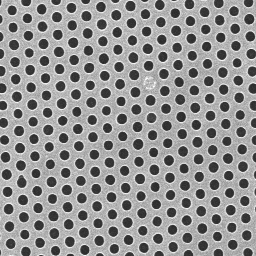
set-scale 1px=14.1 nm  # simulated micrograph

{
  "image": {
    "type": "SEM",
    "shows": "a regular array of holes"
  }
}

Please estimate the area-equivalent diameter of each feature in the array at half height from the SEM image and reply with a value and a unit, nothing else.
142 nm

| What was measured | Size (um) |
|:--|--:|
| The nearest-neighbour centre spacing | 0.237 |